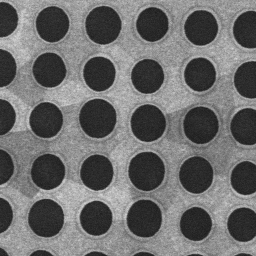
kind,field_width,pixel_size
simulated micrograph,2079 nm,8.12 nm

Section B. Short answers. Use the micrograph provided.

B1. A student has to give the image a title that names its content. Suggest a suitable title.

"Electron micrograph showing a regular array of holes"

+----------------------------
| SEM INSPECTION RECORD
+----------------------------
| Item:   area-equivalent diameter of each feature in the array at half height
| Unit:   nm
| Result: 293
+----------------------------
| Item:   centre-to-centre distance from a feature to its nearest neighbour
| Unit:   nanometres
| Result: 380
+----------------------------